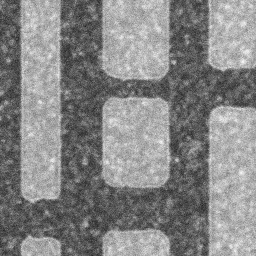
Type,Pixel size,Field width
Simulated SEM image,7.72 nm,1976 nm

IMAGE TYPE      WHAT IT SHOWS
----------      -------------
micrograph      one or a few lines or trenches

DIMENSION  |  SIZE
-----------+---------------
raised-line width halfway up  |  329 nm